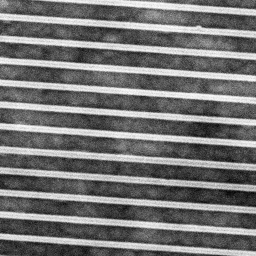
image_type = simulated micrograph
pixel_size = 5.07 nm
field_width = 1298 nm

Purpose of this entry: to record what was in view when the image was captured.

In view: parallel lines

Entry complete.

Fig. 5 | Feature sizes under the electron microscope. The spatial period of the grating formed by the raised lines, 111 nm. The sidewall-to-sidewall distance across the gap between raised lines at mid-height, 83.4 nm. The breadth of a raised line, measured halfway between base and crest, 26.5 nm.